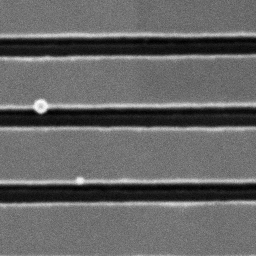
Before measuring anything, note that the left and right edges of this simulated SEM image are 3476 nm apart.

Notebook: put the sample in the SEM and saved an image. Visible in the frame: lines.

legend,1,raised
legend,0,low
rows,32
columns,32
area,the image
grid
11111111111111111111111111111111
11111111111111111111111111111111
11111111111111111111111111111111
11111111111111111111111111111111
11111111111111111111111111111111
00000000000000000000000000000000
00000000000000000000000000000000
11111111111111111111111111111111
11111111111111111111111111111111
11111111111111111111111111111111
11111111111111111111111111111111
11111111111111111111111111111111
11111111111111111111111111111111
11111111111110000000000000000000
00000000000000000000000000000000
00000000000000000000000000000000
11111111111111111111111111111111
11111111111111111111111111111111
11111111111111111111111111111111
11111111111111111111111111111111
11111111111111111111111111111111
11111111111111111111111111111111
11111111111111111111111111111111
00000000000000000000000000000000
00000000000000000000000000000000
11111111111111111111111111111111
11111111111111111111111111111111
11111111111111111111111111111111
11111111111111111111111111111111
11111111111111111111111111111111
11111111111111111111111111111111
11111111111111111111111111111111